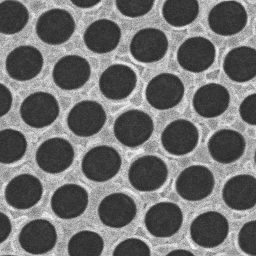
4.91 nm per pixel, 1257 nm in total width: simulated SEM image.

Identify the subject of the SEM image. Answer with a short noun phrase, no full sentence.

a regular array of holes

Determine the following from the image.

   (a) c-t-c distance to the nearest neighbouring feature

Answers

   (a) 232 nm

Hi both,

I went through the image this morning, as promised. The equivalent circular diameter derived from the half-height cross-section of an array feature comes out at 0.18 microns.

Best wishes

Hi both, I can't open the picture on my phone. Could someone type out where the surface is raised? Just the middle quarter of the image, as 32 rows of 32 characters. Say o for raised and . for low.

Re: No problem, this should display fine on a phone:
......oooooo....ooooooooooooo...
.......ooo.......oooooooooooooo.
......ooo.........oooooo...ooooo
......ooo.........oooo.......ooo
......ooo.........ooo........ooo
.....oooo.........ooo.........oo
ooooooooo........ooo..........oo
oooooooooo.......ooo..........oo
ooooooooooo....ooooo..........oo
oooo....ooooooooooooo........ooo
ooo......ooooooooooooo......oooo
oo........ooooooo.oooooooooooooo
o.........ooooo......ooooooooooo
o..........oo.........oooooooooo
o.........ooo.........ooooo.....
o.........oo..........oooo......
oo.......ooo..........ooo.......
ooo.....oooo..........oo........
ooooooooooooo........ooo........
.ooooooooooooo......ooooo.......
..ooooooo..ooooo..ooooooo.......
..oooo.......ooooooooooooo......
...oo.........ooooooooooooo...oo
..ooo.........ooooo.....oooooooo
..oo..........ooo........ooooooo
.ooo..........ooo.........oooooo
ooooo.........oo..........oooo..
ooooo........ooo..........ooo...
oooooo......oooo..........oo....
oooooooo.ooooooo.........ooo....
....ooooooooooooo.......oooo....
.....ooooooooooooo.....ooooo....